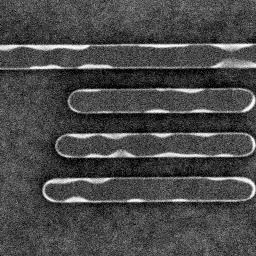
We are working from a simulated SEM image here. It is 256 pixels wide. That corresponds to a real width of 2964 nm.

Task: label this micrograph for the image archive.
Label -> groups of lines, slits or small figures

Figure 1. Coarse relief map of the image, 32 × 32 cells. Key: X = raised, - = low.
--------------------------------
--------------------------------
--------------------------------
--------------------------------
--------------------------------
--------------------------------
XXXXXXXXXXXXXXXXXXXXXXXXXXXXXXXX
XXXXXXXXXXXXXXXXXXXXXXXXXXXXXXXX
XXXX----------------------------
--------------------------------
--------------------------------
---------XXXXXXXXXXXXXXXXXXXXXX-
---------XXXXXXXXXXXXXXXXXXXXXXX
---------XXXXXXXXXXXXXXXXXXXXXX-
--------------------------------
--------------------------------
--------------------------------
-------XXXXXXXXXXXXXXXXXXXXXXXXX
-------XXXXXXXXXXXXXXXXXXXXXXXXX
--------XXXXXX--XXXX-----XX--X--
--------------------------------
--------------------------------
---------XX--XXXXXXXXXXXXXXXXXX-
------XXXXXXXXXXXXXXXXXXXXXXXXXX
------XXXXXXXXXXXXXXXXXXXXXXXXX-
--------------------------------
--------------------------------
--------------------------------
--------------------------------
--------------------------------
--------------------------------
--------------------------------